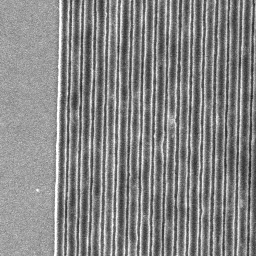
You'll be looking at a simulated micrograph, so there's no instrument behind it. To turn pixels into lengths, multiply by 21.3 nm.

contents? parallel lines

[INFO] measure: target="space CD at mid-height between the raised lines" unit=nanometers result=77.3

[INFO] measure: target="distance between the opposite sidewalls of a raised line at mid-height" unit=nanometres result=192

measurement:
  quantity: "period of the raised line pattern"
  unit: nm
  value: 260